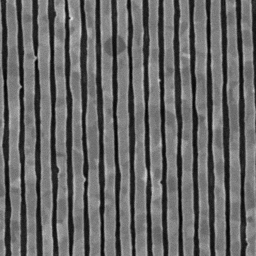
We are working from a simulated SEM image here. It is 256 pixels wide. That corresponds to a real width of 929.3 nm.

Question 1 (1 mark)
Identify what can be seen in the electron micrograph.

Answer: parallel lines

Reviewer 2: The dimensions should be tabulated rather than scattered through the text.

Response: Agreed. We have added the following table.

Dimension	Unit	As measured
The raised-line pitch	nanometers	56.9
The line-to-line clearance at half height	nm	19.5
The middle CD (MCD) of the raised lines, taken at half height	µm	0.0367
